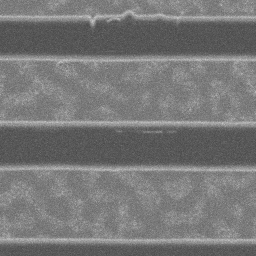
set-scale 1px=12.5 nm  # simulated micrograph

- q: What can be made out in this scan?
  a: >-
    one or a few lines or trenches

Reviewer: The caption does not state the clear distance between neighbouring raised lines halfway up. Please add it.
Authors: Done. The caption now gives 545 nm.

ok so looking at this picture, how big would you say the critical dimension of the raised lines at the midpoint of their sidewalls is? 0.87 µm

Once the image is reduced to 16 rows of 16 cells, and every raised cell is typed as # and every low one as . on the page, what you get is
################
................
................
................
################
################
################
################
................
................
.####...........
################
################
################
################
................